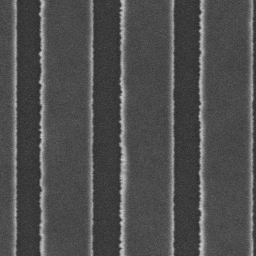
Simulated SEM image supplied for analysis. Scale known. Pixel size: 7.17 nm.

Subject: lines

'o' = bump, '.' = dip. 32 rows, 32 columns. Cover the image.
oo...ooooooo...ooooooo...ooooooo
oo...ooooooo...ooooooo...ooooooo
oo...ooooooo...ooooooo...ooooooo
oo...ooooooo...ooooooo...ooooooo
oo...ooooooo...ooooooo...ooooooo
oo...ooooooo...ooooooo...ooooooo
oo...ooooooo...ooooooo...ooooooo
oo...ooooooo...ooooooo...ooooooo
oo...ooooooo...ooooooo...ooooooo
oo...ooooooo...ooooooo...ooooooo
oo...ooooooo...ooooooo...ooooooo
oo...ooooooo...ooooooo...ooooooo
oo...oooooo....ooooooo...ooooooo
oo...oooooo....ooooooo...ooooooo
oo...ooooooo...ooooooo...ooooooo
oo...ooooooo...ooooooo...ooooooo
oo...ooooooo...ooooooo...ooooooo
oo...ooooooo...ooooooo...ooooooo
oo...oooooo....ooooooo...ooooooo
oo...ooooooo...ooooooo...ooooooo
oo...ooooooo...ooooooo...ooooooo
oo...ooooooo...ooooooo...ooooooo
oo...ooooooo...ooooooo...ooooooo
oo...ooooooo...ooooooo...ooooooo
oo...ooooooo...ooooooo...ooooooo
oo...ooooooo...ooooooo...ooooooo
oo...ooooooo...ooooooo...ooooooo
oo...ooooooo...ooooooo...ooooooo
oo...ooooooo...ooooooo...ooooooo
oo...ooooooo...ooooooo...ooooooo
oo...ooooooo...ooooooo...ooooooo
oo...ooooooo...ooooooo...ooooooo